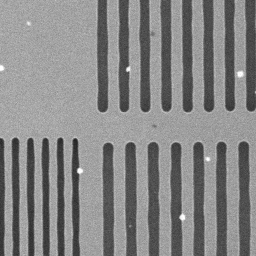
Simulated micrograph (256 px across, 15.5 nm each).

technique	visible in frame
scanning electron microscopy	groups of lines, slits or small figures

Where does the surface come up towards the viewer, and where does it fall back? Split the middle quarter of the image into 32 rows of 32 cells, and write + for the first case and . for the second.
++++++++...+++..+++...++...++...
++++++++...++...+++...++...+++..
++++++++...++....++...++...+++..
++++++++...++...+++...++...++...
++++++++...+++..+++...++...++...
++++++++...+++..+++...++...++...
++++++++...+++..+++...++...++...
++++++++...+++..+++...++...++...
++++++++...+++..+++...++...++...
++++++++...+++..+++...++...++...
++++++++...+++..+++...++...++...
+++++++++..+++..+++..++++..+++..
++++++++++++++++++++++++++++++++
++++++++++++++++++++++++++++++++
++++++++++++++++++++++++++++++++
++++++++++++++++++++++++++++++++
++++++++++++++++++++++++++++++++
++++++++++++++++++++++++++++++++
++++++++++++++++++++++++++++++++
++..++++++++++++++++++.+++++++++
++..++++++..+++...+++...+++..+++
++..++++++...++...+++...++...+++
++..++++++..+++...+++...++...+++
++..++++++..+++...+++...+++..+++
++..++++++..+++...+++...+++..+++
++..++++++..+++...+++...+++..+++
++..+++++....++...+++...+++..+++
++..+++++....++...+++...++...+++
++..++++++...++...+++...++...+++
++..++++++...++...+++...++...+++
++..++++++...++...+++...++...+++
++..++++++...++...+++...++...+++